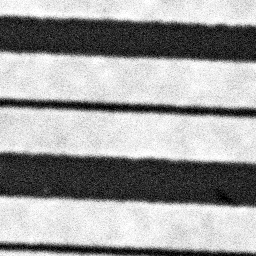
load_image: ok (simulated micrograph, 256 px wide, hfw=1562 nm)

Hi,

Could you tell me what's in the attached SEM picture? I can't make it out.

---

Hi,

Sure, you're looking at lines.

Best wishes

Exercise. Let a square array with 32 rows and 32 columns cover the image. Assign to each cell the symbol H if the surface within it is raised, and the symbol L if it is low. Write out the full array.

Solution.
HHHHHHHHHHHHHHHHHHHHHHHHHHHHHHHH
HHHHHHHHHHHHHHHHHHHHHHHHHHHHHHHH
LLLLLLLLLLLLLLLLLHHLHHHHHHHHHHHH
LLLLLLLLLLLLLLLLLLLLLLLLLLLLLLLL
LLLLLLLLLLLLLLLLLLLLLLLLLLLLLLLL
LLLLLLLLLLLLLLLLLLLLLLLLLLLLLLLL
LLLLLLLLLLLLLLLLLLLLLLLLLLLLLLLL
HHHHHHHHHHHHHHHHHHHLLLLLLLLLLLLL
HHHHHHHHHHHHHHHHHHHHHHHHHHHHHHHH
HHHHHHHHHHHHHHHHHHHHHHHHHHHHHHHH
HHHHHHHHHHHHHHHHHHHHHHHHHHHHHHHH
HHHHHHHHHHHHHHHHHHHHHHHHHHHHHHHH
LLLLLLLLLLHHHHHHHHHHHHHHHHHHHHHH
LLLLLLLLLLLLLLLLLLLLLLLLLLLLLLLL
HHHHHHHHHHHHHHHHHHHHHHLLLLLLLLLL
HHHHHHHHHHHHHHHHHHHHHHHHHHHHHHHH
HHHHHHHHHHHHHHHHHHHHHHHHHHHHHHHH
HHHHHHHHHHHHHHHHHHHHHHHHHHHHHHHH
HHHHHHHHHHHHHHHHHHHHHHHHHHHHHHHH
LLLLLLLLLLLLLLLLHHLHHHHHHHHHHHHH
LLLLLLLLLLLLLLLLLLLLLLLLLLLLLLLL
LLLLLLLLLLLLLLLLLLLLLLLLLLLLLLLL
LLLLLLLLLLLLLLLLLLLLLLLLLLLLLLLL
LLLLLLLLLLLLLLLLLLLLLLLLLLLLLLLL
LLLLLLLLLLLLLLLLLLLLLLLLLLLLLLLL
HHHHHHHHHHHHHHHHHHHLLLLLLLLLLLLL
HHHHHHHHHHHHHHHHHHHHHHHHHHHHHHHH
HHHHHHHHHHHHHHHHHHHHHHHHHHHHHHHH
HHHHHHHHHHHHHHHHHHHHHHHHHHHHHHHH
HHHHHHHHHHHHHHHHHHHHHHHHHHHHHHHH
LLLLLLLLLHHHHHHHHHHHHHHHHHHHHHHH
LLLLLLLLLLLLLLLLLLLLLLLLLLLLLLLL